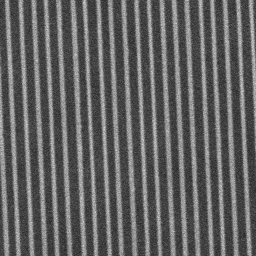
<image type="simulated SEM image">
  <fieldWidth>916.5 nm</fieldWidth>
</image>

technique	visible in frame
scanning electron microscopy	parallel lines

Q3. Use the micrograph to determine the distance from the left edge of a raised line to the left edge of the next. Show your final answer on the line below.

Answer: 45.9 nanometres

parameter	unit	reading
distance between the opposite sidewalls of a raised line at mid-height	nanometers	13.4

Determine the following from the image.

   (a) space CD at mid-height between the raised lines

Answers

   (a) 9.5 px